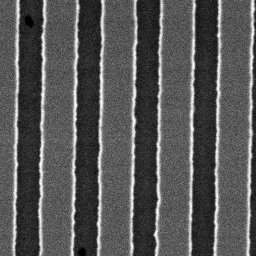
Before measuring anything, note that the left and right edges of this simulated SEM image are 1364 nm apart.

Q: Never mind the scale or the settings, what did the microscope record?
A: lines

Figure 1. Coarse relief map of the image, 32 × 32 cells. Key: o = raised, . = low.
oo...ooooo...oooo...oooo...ooooo
oo...ooooo...oooo...oooo...ooooo
oo...ooooo...oooo...oooo...ooooo
oo...ooooo...oooo...oooo...ooooo
oo...ooooo...oooo...oooo...ooooo
oo...ooooo...oooo...oooo...ooooo
oo...ooooo...oooo...oooo...oooo.
oo...ooooo...oooo...oooo...ooooo
oo...oooo....oooo...oooo...oooo.
oo...ooooo...oooo...oooo...oooo.
oo...ooooo...oooo...oooo...oooo.
oo...oooo....oooo...oooo...oooo.
oo...oooo....oooo...oooo...oooo.
oo...oooo....oooo...oooo...oooo.
oo...oooo....oooo...oooo...oooo.
oo...oooo...ooooo...oooo...oooo.
oo...oooo...ooooo...oooo...oooo.
oo...oooo...ooooo...oooo...oooo.
oo...oooo....oooo...oooo...oooo.
oo...oooo...ooooo...oooo...oooo.
oo...oooo...ooooo...oooo...oooo.
oo...oooo...ooooo...oooo...oooo.
oo...oooo...ooooo...oooo...oooo.
oo...oooo...ooooo...oooo...oooo.
oo...oooo...ooooo...oooo...oooo.
oo...oooo...ooooo...oooo...oooo.
oo...oooo...ooooo...oooo...oooo.
oo...oooo...oooo....oooo...oooo.
oo...oooo...oooo....oooo...oooo.
oo...oooo...ooooo..ooooo...oooo.
oo...oooo...ooooo...oooo...oooo.
oo...oooo...ooooo..ooooo...oooo.